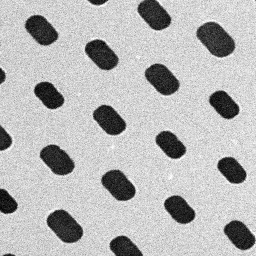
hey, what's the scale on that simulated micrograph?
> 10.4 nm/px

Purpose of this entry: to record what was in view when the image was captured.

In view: a regular array of holes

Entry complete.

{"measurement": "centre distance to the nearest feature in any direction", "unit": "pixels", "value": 65.5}